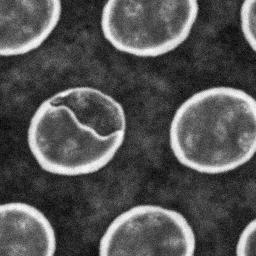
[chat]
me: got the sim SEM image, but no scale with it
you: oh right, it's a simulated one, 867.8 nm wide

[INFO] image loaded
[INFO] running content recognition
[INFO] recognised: raised bodies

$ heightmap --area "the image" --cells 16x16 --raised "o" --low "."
oooo...ooooo...o
ooo....ooooo...o
oo.....oooo.....
................
................
................
............oooo
..ooo......ooooo
..ooooo....ooooo
..ooooo....ooooo
...ooo......oo..
................
................
oo......ooo.....
ooo....ooooo...o
ooo...oooooo...o